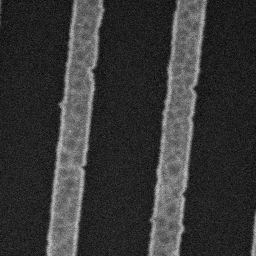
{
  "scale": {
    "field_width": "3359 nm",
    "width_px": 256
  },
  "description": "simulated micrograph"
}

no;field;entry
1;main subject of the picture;one or a few lines or trenches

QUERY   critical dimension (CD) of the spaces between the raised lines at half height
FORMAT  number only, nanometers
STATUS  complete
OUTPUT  1000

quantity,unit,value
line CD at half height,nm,346